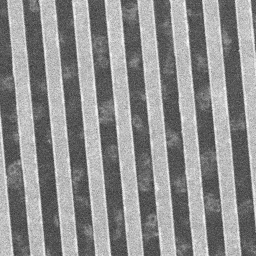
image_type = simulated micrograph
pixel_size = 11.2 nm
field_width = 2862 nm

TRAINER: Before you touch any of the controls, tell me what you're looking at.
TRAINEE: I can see parallel lines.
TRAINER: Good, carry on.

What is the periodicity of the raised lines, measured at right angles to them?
363 nanometres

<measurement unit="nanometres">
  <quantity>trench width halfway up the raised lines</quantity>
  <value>202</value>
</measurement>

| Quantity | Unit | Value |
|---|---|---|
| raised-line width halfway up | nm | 163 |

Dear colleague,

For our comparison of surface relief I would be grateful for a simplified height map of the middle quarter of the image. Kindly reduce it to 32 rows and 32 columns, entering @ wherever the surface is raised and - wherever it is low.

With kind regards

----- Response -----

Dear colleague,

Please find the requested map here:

----@@@-----@@@-----@@@-----@@@@
----@@@-----@@@-----@@@@----@@@@
----@@@-----@@@-----@@@@----@@@@
----@@@-----@@@@----@@@@----@@@@
----@@@-----@@@@----@@@@-----@@@
----@@@@----@@@@----@@@@-----@@@
----@@@@-----@@@-----@@@-----@@@
----@@@@-----@@@-----@@@-----@@@
-----@@@-----@@@-----@@@-----@@@
-----@@@-----@@@-----@@@-----@@@
-----@@@-----@@@-----@@@@----@@@
-----@@@-----@@@-----@@@-----@@@
-----@@@-----@@@-----@@@@----@@@
-----@@@-----@@@-----@@@@----@@@
-----@@@-----@@@@@@--@@@@----@@@
-----@@@-----@@@@----@@@@-----@@
@----@@@@----@@@@----@@@@-----@@
@----@@@@-----@@@-----@@@-----@@
@----@@@@-----@@@-----@@@-----@@
@-----@@@-----@@@-----@@@-----@@
@-----@@@-----@@@-----@@@-----@@
@-----@@@-----@@@-----@@@-----@@
@-----@@@-----@@@-----@@@-----@@
@-----@@@-----@@@-----@@@@----@@
@-----@@@-----@@@-----@@@@----@@
@-----@@@-----@@@@----@@@@----@@
@-----@@@-----@@@@----@@@@-----@
@@----@@@@----@@@@----@@@@-----@
@@----@@@@-----@@@-----@@@-----@
@@----@@@@-----@@@-----@@@-----@
@@----@@@@-----@@@-----@@@-----@
@@----@@@@-----@@@-----@@@-----@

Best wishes